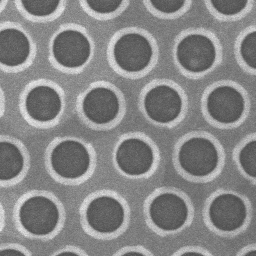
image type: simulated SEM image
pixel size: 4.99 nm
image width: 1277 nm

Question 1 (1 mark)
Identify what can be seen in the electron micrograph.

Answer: a regular array of holes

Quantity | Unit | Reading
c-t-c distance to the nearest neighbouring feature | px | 59.5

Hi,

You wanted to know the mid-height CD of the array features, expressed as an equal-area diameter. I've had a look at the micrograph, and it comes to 200 nm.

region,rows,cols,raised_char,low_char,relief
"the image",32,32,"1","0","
11100001111000011110000111000001
11100001111100111111001111100011
11111111111111111111111111111111
10111111111111111111111111111111
00011110000111100011111000111110
00001100000111000001110000011100
00001100000111000001110000011100
00011110000111000001110000011100
11111111001111100011111000111110
11111111111111111111111111111111
11111011111111111111111111111111
11100001111000111100001111000011
11100000110000011100000111000001
11100000110000011100000111000001
11110001111000011100001111000011
11111111111101111111011111110111
11111111111111111111111111111111
11111111001111100011111000111110
00111110000111100001110000011100
00011100000111000001110000011100
00011100000111100001110000011100
00011110000111100001111000011100
00111111001111111111111111111111
11111111111111111111111111111111
11110011111100111110000111100011
11100001111000011110000111000001
11000001111000001110000011000001
11000001111000001110000111000001
11100001111000011111000111100011
11111111111111111111111111111111
11111111111111111111111111111111
00011110011111110011111001111110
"